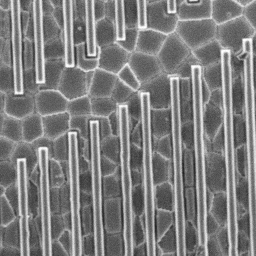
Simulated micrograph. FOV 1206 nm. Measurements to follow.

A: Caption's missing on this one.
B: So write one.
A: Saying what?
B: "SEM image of parallel lines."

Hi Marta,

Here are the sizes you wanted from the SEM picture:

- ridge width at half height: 36.5 nm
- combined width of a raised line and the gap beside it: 122 nm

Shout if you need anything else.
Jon